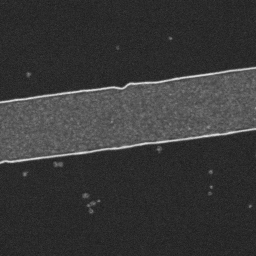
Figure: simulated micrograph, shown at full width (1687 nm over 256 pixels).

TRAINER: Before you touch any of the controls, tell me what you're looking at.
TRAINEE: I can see one or a few lines or trenches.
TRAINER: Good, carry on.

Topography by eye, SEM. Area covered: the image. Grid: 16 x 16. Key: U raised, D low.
UUUUUUUUUUUUUUUU
UUUUUUUUUUUUUUUU
UUUUUUUUUUUUUUUU
UUUUUUUUUUUUUUUU
UUUUUUUUUUUUUUDD
UUUUUUUUDDDDDDDD
DDDDDDDDDDDDDDDD
DDDDDDDDDDDDDDDD
DDDDDDDDDDDDDUUU
DDDDDUUUUUUUUUUU
UUUUUUUUUUUUUUUU
UUUUUUUUUUUUUUUU
UUUUUUUUUUUUUUUU
UUUUUUUUUUUUUUUU
UUUUUUUUUUUUUUUU
UUUUUUUUUUUUUUUU